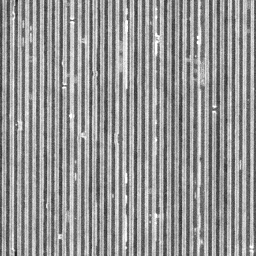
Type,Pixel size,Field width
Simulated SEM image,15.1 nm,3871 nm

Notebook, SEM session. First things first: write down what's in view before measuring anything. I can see parallel lines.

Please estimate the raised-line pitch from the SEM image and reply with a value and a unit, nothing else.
0.114 µm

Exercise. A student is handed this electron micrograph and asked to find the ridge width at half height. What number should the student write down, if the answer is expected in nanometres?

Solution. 43.5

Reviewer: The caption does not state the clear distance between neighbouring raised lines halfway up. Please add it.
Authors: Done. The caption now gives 58.6 nanometres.